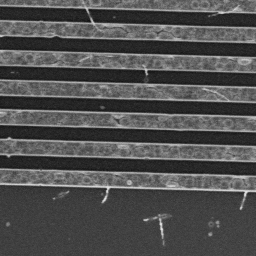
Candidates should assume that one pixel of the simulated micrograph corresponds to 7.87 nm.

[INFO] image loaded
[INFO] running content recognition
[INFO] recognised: parallel lines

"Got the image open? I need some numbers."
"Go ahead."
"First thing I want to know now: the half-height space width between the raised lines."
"116 nanometers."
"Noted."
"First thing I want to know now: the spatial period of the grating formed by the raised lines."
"234 nm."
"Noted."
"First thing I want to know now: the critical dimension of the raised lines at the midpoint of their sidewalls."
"123 nm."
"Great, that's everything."